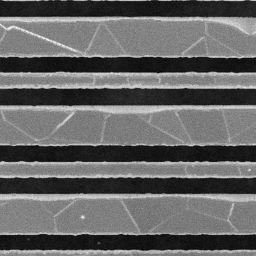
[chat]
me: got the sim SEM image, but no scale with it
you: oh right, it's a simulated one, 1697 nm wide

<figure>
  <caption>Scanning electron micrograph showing lines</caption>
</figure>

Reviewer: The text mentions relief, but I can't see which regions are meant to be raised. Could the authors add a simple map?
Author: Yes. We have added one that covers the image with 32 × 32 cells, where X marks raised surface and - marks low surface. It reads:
--------------------------------
--------------------------------
XXXXXXXXXXXXXXXXXXXXXXXXXXXX----
XXXXXXXXXXXXXXXXXXXXXXXXXXXXXXXX
XXXXXXXXXXXXXXXXXXXXXXXXXXXXXXXX
XXXXXXXXXXXXXXXXXXXXXXXXXXXXXXXX
XXXXXXXXXXXXXXXXXXXXXXXXXXXXXXXX
--------------------------------
--------------------------------
XXXXXXXXXXXXXXXXXXXXXXXXXXXXXXXX
XXXXXXXXXXXXXXXXXXXXXXXXXXXXXXXX
--------------------------------
--------------------------------
XXXXXXXXXXXXX-------XXXXXXXXXXXX
XXXXXXXXXXXXXXXXXXXXXXXXXXXXXXXX
XXXXXXXXXXXXXXXXXXXXXXXXXXXXXXXX
XXXXXXXXXXXXXXXXXXXXXXXXXXXXXXXX
XXXXXXXXXXXXXXXXXXXXXXXXXXXXXXXX
--------------------------------
--------------------------------
XXXXXXXXXXXXXXXXXXXXXXXXXXXXXXXX
XXXXXXXXXXXXXXXXXXXXXXXXXXXXXXXX
--------------------------------
--------------------------------
---------XX------XXXXXXXXX------
XXXXXXXXXXXXXXXXXXXXXXXXXXXXXXXX
XXXXXXXXXXXXXXXXXXXXXXXXXXXXXXXX
XXXXXXXXXXXXXXXXXXXXXXXXXXXXXXXX
XXXXXXXXXXXXXXXXXXXXXXXXXXXXXXXX
--------------------------------
--------------------------------
XXXXXXXXXXXXXXXXXXXXXXXXXXXXXXXX